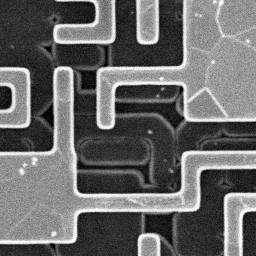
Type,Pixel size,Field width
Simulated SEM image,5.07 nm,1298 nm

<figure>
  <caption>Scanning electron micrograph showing wiring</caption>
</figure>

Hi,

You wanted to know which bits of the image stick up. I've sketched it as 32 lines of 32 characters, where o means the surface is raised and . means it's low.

............oo...ooo...ooooooooo
............oo...ooo...ooooooooo
............oo...ooo...ooooooooo
.......ooooooo...ooo...ooooooooo
.......ooooooo...ooo...ooooooooo
.......................ooooooooo
.......................ooooooooo
.......................ooooooooo
......................oooooooooo
oooo...oo...oooooooooooooooooooo
oooo...oo...oooo......oooooooooo
..oo...oo...oo.........ooooooooo
..oo...oo...oo.........ooooooooo
.ooo...oo...oo.........ooooooooo
oooo...oo...oo.........ooooooooo
ooo....oo...oo..................
.......oo.......................
.......oo.......................
.......oo.......................
ooooooooo..............ooooooooo
ooooooooo..............ooooooooo
ooooooooo..............oo.......
ooooooooo..............oo.......
oooooooooo.............oo.......
ooooooooooooooooooooooooo....ooo
ooooooooooooooooooooooooo...oooo
oooooooooo..................ooo.
oooooooooo..................oo..
ooooooooo...................oo..
ooooooooo.........o.........oo..
.................ooo........oo..
.................ooo........oo..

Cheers